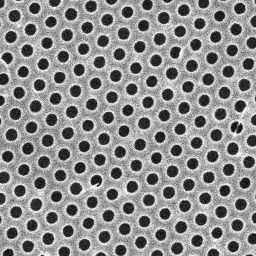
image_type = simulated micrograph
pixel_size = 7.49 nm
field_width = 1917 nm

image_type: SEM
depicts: a regular array of holes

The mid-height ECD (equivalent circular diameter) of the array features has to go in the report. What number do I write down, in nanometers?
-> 87.8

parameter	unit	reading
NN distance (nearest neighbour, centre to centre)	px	20.9